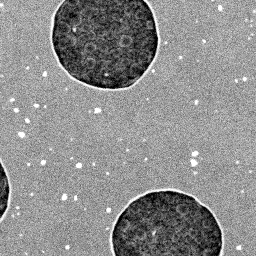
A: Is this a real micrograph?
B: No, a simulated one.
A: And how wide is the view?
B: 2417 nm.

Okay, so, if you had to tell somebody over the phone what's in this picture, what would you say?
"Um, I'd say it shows holes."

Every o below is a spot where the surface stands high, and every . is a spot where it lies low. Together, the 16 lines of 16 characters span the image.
oooo.....ooooooo
ooo.......oooooo
ooo.......oooooo
oooo......oooooo
oooo.....ooooooo
oooooo..oooooooo
oooooooooooooooo
oooooooooooooooo
oooooooooooooooo
oooooooooooooooo
oooooooooooooooo
.ooooooooooooooo
.ooooooo....oooo
oooooooo.....ooo
ooooooo.......oo
ooooooo.......oo